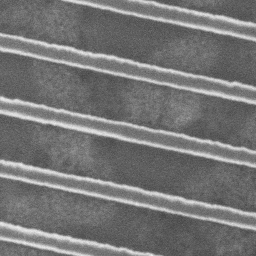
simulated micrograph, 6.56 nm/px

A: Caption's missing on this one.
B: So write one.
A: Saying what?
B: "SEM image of lines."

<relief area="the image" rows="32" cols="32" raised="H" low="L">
LLLLLLLLLLHHHHHHHHHHLLLLLLLLLLLL
LLLLLLLLLLLLLLLHHHHHHHHHHLLLLLLL
LLLLLLLLLLLLLLLLLLLLHHHHHHHHHLLL
LLLLLLLLLLLLLLLLLLLLLLLLLHHHHHHH
HLLLLLLLLLLLLLLLLLLLLLLLLLLLLHHH
HHHHHHLLLLLLLLLLLLLLLLLLLLLLLLLL
LHHHHHHHHHHLLLLLLLLLLLLLLLLLLLLL
LLLLLLHHHHHHHHHHLLLLLLLLLLLLLLLL
LLLLLLLLLLLHHHHHHHHHLLLLLLLLLLLL
LLLLLLLLLLLLLLLHHHHHHHHHHLLLLLLL
LLLLLLLLLLLLLLLLLLLLHHHHHHHHHHLL
LLLLLLLLLLLLLLLLLLLLLLLLLHHHHHHH
HHLLLLLLLLLLLLLLLLLLLLLLLLLLLLHH
HHHHHHHLLLLLLLLLLLLLLLLLLLLLLLLL
LLHHHHHHHHHLLLLLLLLLLLLLLLLLLLLL
LLLLLLHHHHHHHHHHLLLLLLLLLLLLLLLL
LLLLLLLLLLLHHHHHHHHHHLLLLLLLLLLL
LLLLLLLLLLLLLLLLHHHHHHHHHLLLLLLL
LLLLLLLLLLLLLLLLLLLLHHHHHHHHHHLL
LLLLLLLLLLLLLLLLLLLLLLLLLLHHHHHH
HHHLLLLLLLLLLLLLLLLLLLLLLLLLLLHH
HHHHHHHLLLLLLLLLLLLLLLLLLLLLLLLL
LLLHHHHHHHHHLLLLLLLLLLLLLLLLLLLL
LLLLLLLHHHHHHHHHHLLLLLLLLLLLLLLL
LLLLLLLLLLLLHHHHHHHHHLLLLLLLLLLL
LLLLLLLLLLLLLLLLLHHHHHHHHHLLLLLL
LLLLLLLLLLLLLLLLLLLLLHHHHHHHHHLL
LLLLLLLLLLLLLLLLLLLLLLLLLLHHHHHH
HHHLLLLLLLLLLLLLLLLLLLLLLLLLLLLH
HHHHHHHHLLLLLLLLLLLLLLLLLLLLLLLL
LLLHHHHHHHHHHLLLLLLLLLLLLLLLLLLL
LLLLLLLHHHHHHHHHHLLLLLLLLLLLLLLL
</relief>